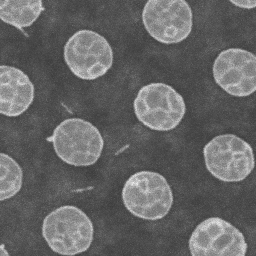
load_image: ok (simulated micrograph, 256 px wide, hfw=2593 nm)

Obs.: raised bodies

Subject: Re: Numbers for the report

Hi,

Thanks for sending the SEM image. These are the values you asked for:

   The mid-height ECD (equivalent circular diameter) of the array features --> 0.482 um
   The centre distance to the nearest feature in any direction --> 891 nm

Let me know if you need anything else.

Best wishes